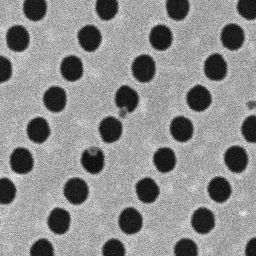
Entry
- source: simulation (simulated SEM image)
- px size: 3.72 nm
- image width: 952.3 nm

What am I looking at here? a regular array of holes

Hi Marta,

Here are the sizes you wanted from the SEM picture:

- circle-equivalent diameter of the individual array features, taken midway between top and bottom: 93.9 nanometers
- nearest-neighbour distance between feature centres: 0.13 micrometres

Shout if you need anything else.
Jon